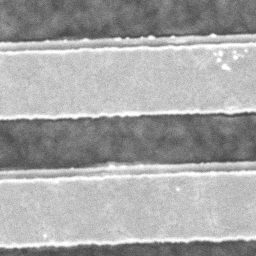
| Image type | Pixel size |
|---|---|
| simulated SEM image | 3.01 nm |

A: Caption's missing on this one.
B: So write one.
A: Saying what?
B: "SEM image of lines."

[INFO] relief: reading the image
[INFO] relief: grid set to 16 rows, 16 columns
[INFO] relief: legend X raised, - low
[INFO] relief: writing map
----------------
----------------
-------XXXXXXXXX
XXXXXXXXXXXXXXXX
XXXXXXXXXXXXXXXX
XXXXXXXXXXXXXXXX
XXXXXXXXXXXXXXXX
----------------
----------------
----------------
----------XXXXXX
XXXXXXXXXXXXXXXX
XXXXXXXXXXXXXXXX
XXXXXXXXXXXXXXXX
XXXXXXXXXXXXXXXX
----------------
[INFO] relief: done